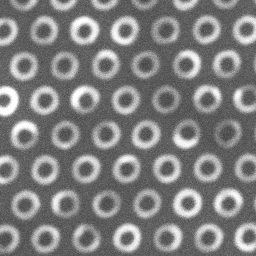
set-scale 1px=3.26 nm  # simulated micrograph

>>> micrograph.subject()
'a regular array of ring-shaped raised bodies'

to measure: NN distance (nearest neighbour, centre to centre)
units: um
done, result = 0.129